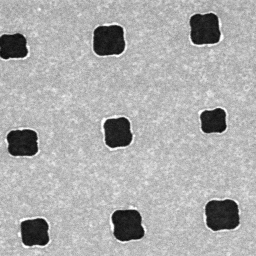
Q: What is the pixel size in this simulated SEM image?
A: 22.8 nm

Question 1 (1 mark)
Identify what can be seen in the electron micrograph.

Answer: a regular array of holes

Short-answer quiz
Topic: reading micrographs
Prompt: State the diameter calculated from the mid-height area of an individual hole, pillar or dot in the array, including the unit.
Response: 0.741 microns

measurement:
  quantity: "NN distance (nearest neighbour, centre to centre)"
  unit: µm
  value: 2.1